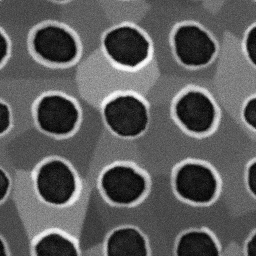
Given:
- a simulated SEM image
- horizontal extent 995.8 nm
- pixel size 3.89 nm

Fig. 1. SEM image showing a regular array of holes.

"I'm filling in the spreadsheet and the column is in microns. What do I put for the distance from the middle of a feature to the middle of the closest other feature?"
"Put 0.261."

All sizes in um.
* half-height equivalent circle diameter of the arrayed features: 0.163